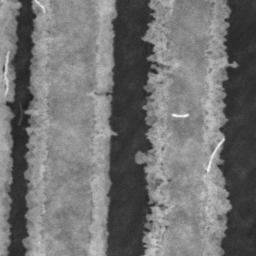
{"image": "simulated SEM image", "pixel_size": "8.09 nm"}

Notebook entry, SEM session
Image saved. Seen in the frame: one or a few lines or trenches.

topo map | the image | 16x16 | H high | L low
LLLHHHHLLLHHHHLL
LLLHHHLLLLHHHHLL
LLLHHHLLLLHHHHLL
LLLHHHLLLLHHHHLL
LLLHHHLLLLHHHHLL
LLLHHHLLLLHHHLLL
LLLHHHLLLLHHHLLL
LLLHHHLLLLHHHLLL
LLHHHHLLLLHHHLLL
LLHHHHLLLLHHHLLL
LLHHHHLLLLHHHLLL
LLHHHHLLLLHHHLLL
LLHHHHLLLLHHHHLL
LLHHHHLLLLHHHHLL
LLHHHHLLLLHHHLLL
LLHHHHLLLLHHHLLL